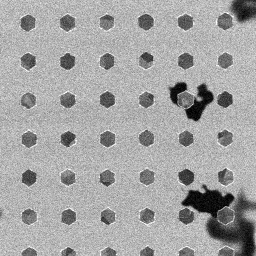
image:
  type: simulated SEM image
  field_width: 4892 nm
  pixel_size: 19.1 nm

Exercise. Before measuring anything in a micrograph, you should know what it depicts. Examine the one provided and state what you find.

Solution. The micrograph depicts a regular array of raised bodies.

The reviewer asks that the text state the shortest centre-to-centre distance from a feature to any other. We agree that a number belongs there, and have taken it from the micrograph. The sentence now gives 738 nm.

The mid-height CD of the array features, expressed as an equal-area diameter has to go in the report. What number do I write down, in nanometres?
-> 320